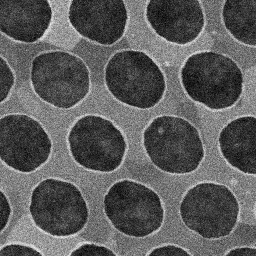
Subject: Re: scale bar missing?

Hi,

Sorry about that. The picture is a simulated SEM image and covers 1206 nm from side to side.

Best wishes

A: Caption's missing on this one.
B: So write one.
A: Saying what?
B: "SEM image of a regular array of holes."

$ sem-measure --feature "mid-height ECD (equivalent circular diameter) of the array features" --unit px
59.1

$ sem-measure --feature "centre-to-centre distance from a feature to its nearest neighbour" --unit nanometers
352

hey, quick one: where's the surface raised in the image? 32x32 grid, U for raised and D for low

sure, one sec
DDDDDDUUUDDDDDDDUUDDDDDDDUUUDDDD
DDDDDDDUUDDDDDDDUUDDDDDDDUUUDDDD
DDDDDDUUUDDDDDDDUUDDDDDDDDUUDDDD
DDDDDDUUUDDDDDDDUUUDDDDDDUUUDDDD
UDDDDUUUUUDDDDDUUUUUDDDDDUUUUDDD
UUUUUUUUUUUUDDUUUUUUUUDUUUUUUUDD
UUUUUUDDUUUUUUUDDDUUUUUUUDDUUUUU
DUUUDDDDDDUUUUDDDDDUUUUDDDDDDUUU
DUUUDDDDDDDUUDDDDDDDUUUDDDDDDDUU
DDUUDDDDDDDUUDDDDDDDDUUDDDDDDDUU
DDUUDDDDDDDUUDDDDDDDDUUDDDDDDDUU
DUUUDDDDDDDUUUDDDDDDDUUDDDDDDDUU
DUUUUDDDDDUUUUUDDDDDUUUUDDDDDDUU
UUUUUUUUDUUUUUUUUDDUUUUUUUDDUUUU
UDDDUUUUUUDDUUUUUUUUUUUUUUUUUUUU
DDDDDUUUUDDDDDUUUUUDDDDDUUUUUDDD
DDDDDDUUUDDDDDDUUUDDDDDDDUUUDDDD
DDDDDDUUDDDDDDDDUUDDDDDDDUUDDDDD
DDDDDDUUUDDDDDDDUUDDDDDDDUUDDDDD
DDDDDDUUUDDDDDDDUUUDDDDDDUUUDDDD
UDDDDUUUUUDDDDDUUUUDDDDDDUUUUDDD
UUUDUUUUUUUUDDUUUUUUUDDDUUUUUUDD
UUUUUUDDUUUUUUUDUUUUUUUUUUUUUUUU
UUUUDDDDDDUUUUDDDDDUUUUUDDDDDUUU
DUUUDDDDDDUUUDDDDDDDUUUDDDDDDUUU
DUUUDDDDDDDUUDDDDDDDUUUDDDDDDDUU
DUUUDDDDDDDUUDDDDDDDUUDDDDDDDDUU
DUUUDDDDDDDUUUDDDDDDUUUDDDDDDDUU
DUUUUDDDDDDUUUDDDDDDUUUUDDDDDUUU
UUUUUUUDDUUUUUUUDDUUUUUUUDDDUUUU
UDDUUUUUUUDDUUUUUUUUUUUUUUUUUUUU
DDDDDUUUUDDDDDUUUUUDDDDUUUUUUDDD